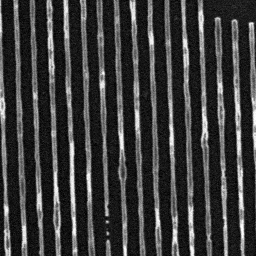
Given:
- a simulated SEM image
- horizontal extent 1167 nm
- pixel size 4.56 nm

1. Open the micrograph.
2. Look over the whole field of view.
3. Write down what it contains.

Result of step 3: parallel lines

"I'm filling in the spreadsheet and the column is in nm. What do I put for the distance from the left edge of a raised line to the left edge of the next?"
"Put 76.5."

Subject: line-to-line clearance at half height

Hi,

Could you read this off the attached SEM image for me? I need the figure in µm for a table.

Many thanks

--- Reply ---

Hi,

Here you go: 0.057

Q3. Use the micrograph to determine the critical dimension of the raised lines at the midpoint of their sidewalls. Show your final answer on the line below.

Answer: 17.7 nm